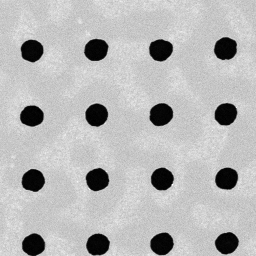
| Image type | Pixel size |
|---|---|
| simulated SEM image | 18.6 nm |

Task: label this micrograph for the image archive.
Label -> a regular array of holes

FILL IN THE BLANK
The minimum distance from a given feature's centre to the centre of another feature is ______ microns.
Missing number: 1.19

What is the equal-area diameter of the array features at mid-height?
422 nm